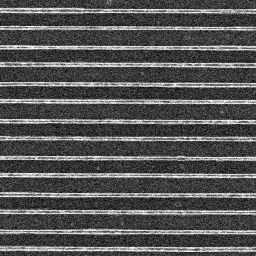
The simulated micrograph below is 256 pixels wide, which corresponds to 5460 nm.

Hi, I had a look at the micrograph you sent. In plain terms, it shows parallel lines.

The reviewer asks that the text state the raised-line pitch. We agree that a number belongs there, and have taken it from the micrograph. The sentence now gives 0.391 micrometres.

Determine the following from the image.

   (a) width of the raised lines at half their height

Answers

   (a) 74.6 nm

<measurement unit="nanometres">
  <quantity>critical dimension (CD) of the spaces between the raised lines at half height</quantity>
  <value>301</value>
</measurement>